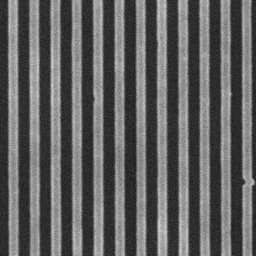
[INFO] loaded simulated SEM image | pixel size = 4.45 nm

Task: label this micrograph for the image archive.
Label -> parallel lines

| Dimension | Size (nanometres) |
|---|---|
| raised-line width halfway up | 38.9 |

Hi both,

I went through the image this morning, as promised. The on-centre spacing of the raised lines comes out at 94.5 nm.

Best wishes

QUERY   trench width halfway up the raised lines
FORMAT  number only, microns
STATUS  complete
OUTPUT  0.0583